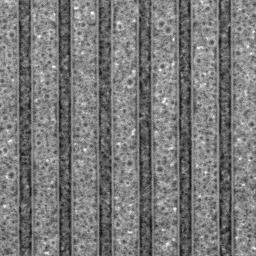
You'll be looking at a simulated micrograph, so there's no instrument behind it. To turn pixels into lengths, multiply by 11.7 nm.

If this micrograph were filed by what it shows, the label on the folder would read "parallel lines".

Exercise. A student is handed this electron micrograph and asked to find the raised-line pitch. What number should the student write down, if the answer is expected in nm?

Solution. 466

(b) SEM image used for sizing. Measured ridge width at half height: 0.312 microns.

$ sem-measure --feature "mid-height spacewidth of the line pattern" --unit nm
156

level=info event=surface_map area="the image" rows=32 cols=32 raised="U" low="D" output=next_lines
UUDDUUUDDUUUDDUUUDDUUUDDUUUDDUUU
UUDDUUUDDUUUDDUUUDDUUUDDUUUDDUUU
UUDDUUUDDUUUDDUUUDDUUUDDUUUDDUUU
UUDDUUUDDUUUDDUUUDDUUUDDUUUDDUUU
UUDDUUUDDUUUDDUUUDDUUUDDUUUDDUUU
UUDDUUUDDUUUDDUUUDDUUUDDUUUDDUUU
UUDDUUUDDUUUDDUUUDDUUUDDUUUDDUUU
UUDDUUUDDUUUDDUUUDDUUUDDUUUDDUUU
UUDDUUUDDUUUDDUUUDDUUUDDUUUDDUUU
UUDDUUUDDUUUDDUUUDDUUUDDUUUDDUUU
UUDDUUUDDUUUDDUUUDDUUUDDUUUDDUUU
UUDDUUUDDUUUDDUUUDDUUUDDUUUDDUUU
UUDDUUUDDUUUDDUUUDDUUUDDUUUDDUUU
UUDDUUUDDUUUDDUUUDDUUUDDUUUDDUUU
UUDDUUUDDUUUDDUUUDDUUUDDUUUDDUUU
UUDDUUUDDUUUDDUUUDDUUUDDUUUDDUUU
UUDDUUUDDUUUDDUUUDDUUUDDUUUDDUUU
UUDDUUUDDUUUDDUUUDDUUUDDUUUDDUUU
UUDDUUUDDUUUDDUUUDDUUUDDUUUDDUUU
UUDDUUUDDUUUDDUUUDDUUUDDUUUDDUUU
UUDDUUUDDUUUDDUUUDDUUUDDUUUDDUUU
UUDDUUUDDUUUDDUUUDDUUUDDUUUDDUUU
UUDDUUUDDUUUDDUUUDDUUUDDUUUDDUUU
UUDDUUUDDUUUDDUUUDDUUUDDUUUDDUUU
UUDDUUUDDUUUDDUUUDDUUUDDUUUDDUUU
UUDDUUUDDUUUDDUUUDDUUUDDUUUDDUUU
UUDDUUUDDUUUDDUUUDDUUUDDUUUDDUUU
UUDDUUUDDUUUDDUUUDDUUUDDUUUDDUUU
UUDDUUUDDUUUDDUUUDDUUUDDUUUDDUUU
UUDDUUUDDUUUDDUUUDDUUUDDUUUDDUUU
UUDDUUUDDUUUDDUUUDDUUUDDUUUDDUUU
UUDDUUUDDUUUDDUUUDDUUUDDUUUDDUUU